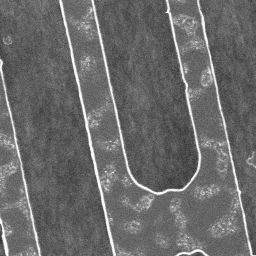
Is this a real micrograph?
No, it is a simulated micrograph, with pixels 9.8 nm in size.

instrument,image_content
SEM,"one or a few lines or trenches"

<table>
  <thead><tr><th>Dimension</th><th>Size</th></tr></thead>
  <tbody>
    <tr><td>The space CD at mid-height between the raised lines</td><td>706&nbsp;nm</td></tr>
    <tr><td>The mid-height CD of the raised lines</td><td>309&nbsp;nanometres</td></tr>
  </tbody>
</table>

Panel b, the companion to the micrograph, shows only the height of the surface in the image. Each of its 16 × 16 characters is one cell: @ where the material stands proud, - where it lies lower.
----@@-----@----
----@@-----@@---
----@@-----@@---
-----@@----@@---
-----@@----@@---
-----@@-----@@--
@----@@-----@@--
@----@@-----@@--
@-----@@----@@--
@-----@@----@@--
@-----@@----@@@-
@@----@@@---@@@-
@@----@@@@@@@@@-
@@-----@@@@@@@@-
@@-----@@@@@@@@-
@@-----@@@@@@@@@